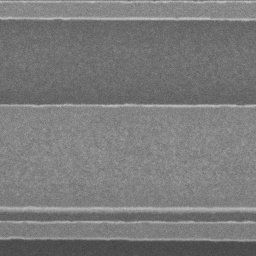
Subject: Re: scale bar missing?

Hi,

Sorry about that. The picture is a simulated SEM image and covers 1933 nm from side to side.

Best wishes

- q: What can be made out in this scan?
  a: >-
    lines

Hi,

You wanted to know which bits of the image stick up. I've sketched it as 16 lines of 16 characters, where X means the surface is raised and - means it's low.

XXXXXXXXXXXXXXXX
----------------
----------------
----------------
----------------
----------------
----------------
XXXXXXXXXXXXXXXX
XXXXXXXXXXXXXXXX
XXXXXXXXXXXXXXXX
XXXXXXXXXXXXXXXX
XXXXXXXXXXXXXXXX
XXXXXXXXXXXXXXXX
XXXXXXXXXXXXXXXX
XXXXXXXXXXXXXXXX
----------------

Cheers